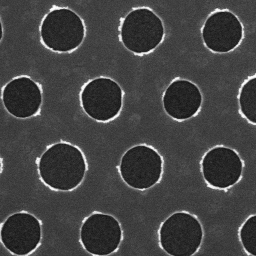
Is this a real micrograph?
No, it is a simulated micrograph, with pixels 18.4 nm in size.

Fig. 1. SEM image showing a regular array of holes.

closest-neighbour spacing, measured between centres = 1440 nm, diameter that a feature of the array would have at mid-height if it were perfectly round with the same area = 756 nanometers